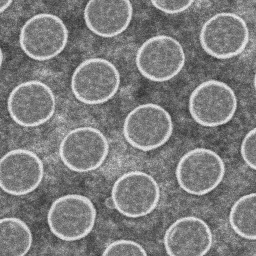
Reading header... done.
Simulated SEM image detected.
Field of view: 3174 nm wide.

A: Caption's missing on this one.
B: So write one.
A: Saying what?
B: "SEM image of a regular array of raised bodies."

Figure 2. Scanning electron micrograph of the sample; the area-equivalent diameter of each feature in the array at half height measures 545 nm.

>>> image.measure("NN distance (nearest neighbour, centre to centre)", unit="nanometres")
844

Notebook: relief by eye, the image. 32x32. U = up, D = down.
UDDDDDDDDDDUUUUUDDDUUUUUDDDDDDDD
DDDDDDDDDDDUUUUUDDDDDDDDDDDDDDDD
DDDDUUUDDDDUUUUUDDDDDDDDDDUUUUDD
DDDUUUUUDDDUUUUUDDDDDDDDDUUUUUUD
DDDUUUUUDDDDDDDDDDDDDDDDDUUUUUUD
DDDUUUUUDDDDDDDDDDUUUUDDDUUUUUUD
DDDUUUUDDDDDDDDDDUUUUUUDDDUUUUDD
DDDDDDDDDDDDDDDDDUUUUUUDDDDDDDDD
DDDDDDDDDDUUUUDDDUUUUUUDDDDDDDDD
DDDDDDDDDUUUUUUDDDDUUUDDDDDDDDDD
DDDUUDDDDUUUUUUDDDDDDDDDDDUUDDDD
DDUUUUDDDUUUUUDDDDDDDDDDUUUUUDDD
DUUUUUUDDDUUUDDDDDDDDDDDUUUUUDDD
DUUUUUUDDDDDDDDDDUUUDDDDUUUUUDDD
DDUUUUDDDDDDDDDDUUUUUDDDUUUUUDDD
DDDUUDDDDDDDDDDDUUUUUDDDDDUDDDDD
DDDDDDDDDUUUDDDDUUUUUDDDDDDDDDDD
DDDDDDDDUUUUUDDDUUUUUDDDDDDDDDDU
DDDDDDDDUUUUUDDDDDUDDDDDDDDDDDUU
DUUUDDDDUUUUUDDDDDDDDDDUUUUDDDUU
UUUUUDDDUUUUDDDDDDDDDDUUUUUUDDDU
UUUUUDDDDDDDDDDDDDDDDDUUUUUUDDDD
UUUUUDDDDDDDDDDUUUUDDDUUUUUDDDDD
UUUUDDDDDDDDDDUUUUUUDDDUUUUDDDDD
DDDDDDDDDDDDDDUUUUUUDDDDDDDDDDDU
DDDDDDDUUUUDDDUUUUUDDDDDDDDDDDUU
DDDDDDUUUUUUDDDUUUDDDDDDDDDDDUUU
UUDDDDUUUUUUDDDDDDDDDDDUUDDDDUUU
UUUDDDUUUUUDDDDDDDDDDUUUUUDDDUUU
UUUUDDDUUUDDDDDDDDDDDUUUUUDDDDDU
UUUUDDDDDDDDDDUUUDDDDUUUUUDDDDDD
UUUDDDDDDDDDDUUUUUDDDUUUUUDDDDDD